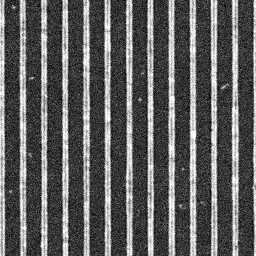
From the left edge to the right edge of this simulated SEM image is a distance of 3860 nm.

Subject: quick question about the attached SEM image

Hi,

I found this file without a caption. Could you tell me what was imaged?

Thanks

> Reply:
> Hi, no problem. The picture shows parallel lines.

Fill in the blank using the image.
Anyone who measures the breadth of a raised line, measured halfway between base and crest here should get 45.2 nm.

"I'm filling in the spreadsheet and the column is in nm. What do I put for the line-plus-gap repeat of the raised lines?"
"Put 320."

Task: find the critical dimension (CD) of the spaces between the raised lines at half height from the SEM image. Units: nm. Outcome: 270